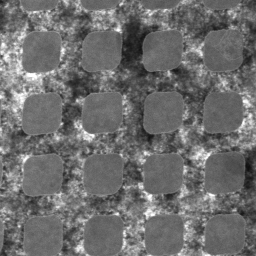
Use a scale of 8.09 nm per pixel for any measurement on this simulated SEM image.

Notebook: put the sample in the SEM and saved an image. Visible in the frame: a regular array of raised bodies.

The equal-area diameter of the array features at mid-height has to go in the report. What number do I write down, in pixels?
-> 43.6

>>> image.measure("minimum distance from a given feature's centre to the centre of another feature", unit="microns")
0.488